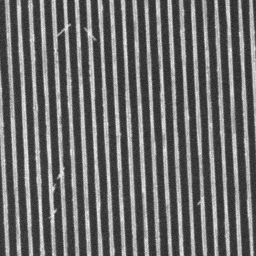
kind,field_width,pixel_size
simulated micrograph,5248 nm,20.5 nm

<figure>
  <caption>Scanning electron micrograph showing parallel lines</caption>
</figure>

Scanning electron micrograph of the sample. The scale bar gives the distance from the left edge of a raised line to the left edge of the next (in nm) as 238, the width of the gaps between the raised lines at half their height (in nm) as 182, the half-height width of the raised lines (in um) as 0.0588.